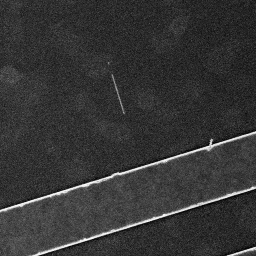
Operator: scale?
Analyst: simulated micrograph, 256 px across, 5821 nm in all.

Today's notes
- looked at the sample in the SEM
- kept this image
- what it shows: one or a few lines or trenches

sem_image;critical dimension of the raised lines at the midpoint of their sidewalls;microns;1.21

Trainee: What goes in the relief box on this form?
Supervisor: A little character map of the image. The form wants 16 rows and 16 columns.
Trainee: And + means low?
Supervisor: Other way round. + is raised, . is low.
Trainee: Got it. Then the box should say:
................
................
................
................
................
................
................
................
...............+
............++++
.........+++++++
.....+++++++++++
..++++++++++++..
++++++++++......
+++++++.........
++++............